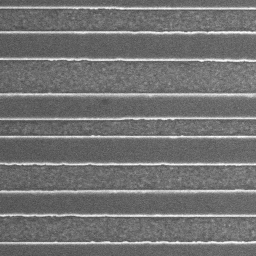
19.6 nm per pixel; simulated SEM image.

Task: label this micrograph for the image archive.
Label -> lines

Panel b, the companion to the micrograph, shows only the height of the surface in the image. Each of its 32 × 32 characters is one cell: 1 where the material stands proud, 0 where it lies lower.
11111111111111111111111111111111
00000000000000000000000000000000
00000000000000000000000000000000
00000000000000000000000000000000
11111111111111111111111111111111
11111111111111111111111111111111
11111111111111111111111111111111
00000000000000000000000001111111
00000000000000000000000000000000
00000000000000000000000000000000
00000000000000000000000000000000
00000000000000000000000000000000
11111111111111111111111111111111
11111111111111111111111111111111
11111111111111111111111111111111
00000000000000000000000000000000
00000000000000000000000000000000
11111111111111111111111111111111
11111111111111111111111111111111
11111111111111111111111111111111
11111111111111111111111111111111
00000000000000000000000000000000
00000000000000000000000000000000
00000000000000000000000000000000
11111111111111111111111111111111
11111111111111111111111111111111
11111111111111111111111111111111
00000000000000000000000000000000
00000000000000000000000000000000
00000000000000000000000000000000
11111111111111111111111111111111
11111111111111111111111111111111